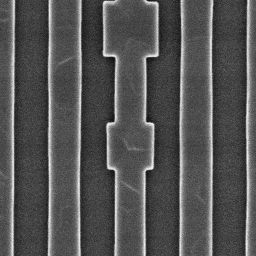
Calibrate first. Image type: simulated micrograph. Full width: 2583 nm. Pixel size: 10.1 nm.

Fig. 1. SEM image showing wiring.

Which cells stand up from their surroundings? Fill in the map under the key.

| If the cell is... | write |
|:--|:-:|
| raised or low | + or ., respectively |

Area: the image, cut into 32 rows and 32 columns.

++....++++...+++++++...++++....+
++....++++...+++++++...+++.....+
++....++++...+++++++...+++.....+
++....++++...+++++++...+++.....+
++....++++...+++++++...+++.....+
++....++++...+++++++...+++.....+
++....++++...+++++++...+++.....+
++....++++....++++.....+++.....+
++....++++....++++.....+++.....+
++....++++....++++.....+++.....+
++....++++....++++.....+++.....+
++....++++....++++.....+++.....+
++....++++....++++.....+++.....+
++....++++....++++.....+++.....+
++....++++....++++.....+++.....+
++....++++....+++++....+++.....+
++....++++...++++++....+++.....+
++....++++...++++++....+++.....+
++....++++...++++++....+++.....+
++....++++...++++++....+++.....+
++....++++...++++++....+++.....+
++....++++....++++.....+++.....+
++....++++....++++.....+++.....+
++....++++....++++.....+++.....+
++....++++....++++.....+++.....+
++....++++....++++.....+++.....+
++....++++....++++.....+++.....+
++....++++....++++.....+++.....+
++....++++....++++.....+++.....+
++....++++....++++.....+++.....+
++....++++....++++.....+++.....+
++....++++....++++.....+++.....+